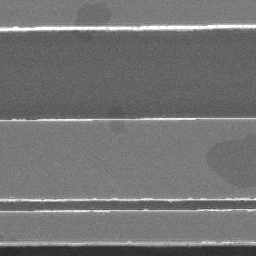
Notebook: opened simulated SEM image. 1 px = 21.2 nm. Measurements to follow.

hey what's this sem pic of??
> lines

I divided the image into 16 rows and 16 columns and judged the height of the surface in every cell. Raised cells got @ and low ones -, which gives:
@@@@@@@@@@@@@@@@
@@@@@@@@@@@@@@@@
----------------
----------------
----------------
----------------
----------------
----@@@@@@@@@@@@
@@@@@@@@@@@@@@@@
@@@@@@@@@@@@@@@@
@@@@@@@@@@@@@@@@
@@@@@@@@@@@@@@@@
@@@@@@@@@@@@@@@@
@@@@@@@@@@@@@@@@
@@@@@@@@@@@@@@@@
----------------